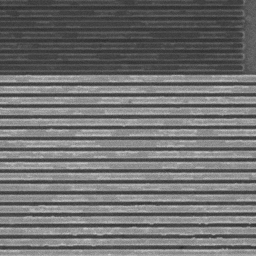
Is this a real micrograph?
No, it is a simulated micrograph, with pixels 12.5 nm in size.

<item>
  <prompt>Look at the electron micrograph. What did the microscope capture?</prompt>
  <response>parallel lines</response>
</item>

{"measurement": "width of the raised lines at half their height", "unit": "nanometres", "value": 78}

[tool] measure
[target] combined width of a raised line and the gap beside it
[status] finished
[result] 136 nanometres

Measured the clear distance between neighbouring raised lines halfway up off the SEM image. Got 56.1 nm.